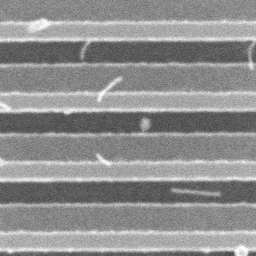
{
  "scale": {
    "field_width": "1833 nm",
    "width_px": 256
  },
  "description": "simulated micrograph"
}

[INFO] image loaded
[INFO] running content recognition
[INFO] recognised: lines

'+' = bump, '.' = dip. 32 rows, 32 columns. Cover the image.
++++++++++++++++++++++++++++++++
++++++++++++++++++++++++++++++++
++++++++++++++++++++++++++++++++
++++++++++++++++++++++++++++++++
++++++++++++++++++++++++++++++++
................................
................................
................................
++++++++++++++++++++++++++++++++
++++++++++++++++++++++++++++++++
++++++++++++++++++++++++++++++++
++++++++++++++++++++++++++++++++
++++++++++++++++++++++++++++++++
++++++++++++++++++++++++++++++++
................................
................................
................................
++++++++++++++++++++++++++++++++
++++++++++++++++++++++++++++++++
++++++++++++++++++++++++++++++++
++++++++++++++++++++++++++++++++
++++++++++++++++++++++++++++++++
++++++++.++.++.+................
................................
................................
................................
++++++++++++++++++++++++++++++++
++++++++++++++++++++++++++++++++
++++++++++++++++++++++++++++++++
++++++++++++++++++++++++++++++++
++++++++++++++++++++++++++++++++
.............................++.